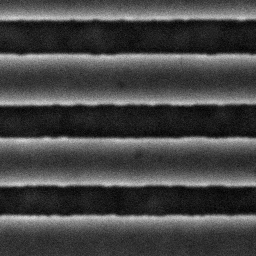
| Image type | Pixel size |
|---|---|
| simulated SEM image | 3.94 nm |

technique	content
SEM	lines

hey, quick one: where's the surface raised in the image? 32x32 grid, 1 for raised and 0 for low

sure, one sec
11111111111111111111111111111111
11111111111111111111111111111111
00000000000000000000000000000000
00000000000000000000000000000000
00000000000000000000000000000000
00000000000000000000000000000000
00000000000000000000000000000000
11111111111111111111111111111111
11111111111111111111111111111111
11111111111111111111111111111111
11111111111111111111111111111111
11111111111111111111111111111111
11111111111111111111111111111111
00000000000000000000000000000000
00000000000000000000000000000000
00000000000000000000000000000000
00000000000000000000000000000000
11111111111111111111111111111111
11111111111111111111111111111111
11111111111111111111111111111111
11111111111111111111111111111111
11111111111111111111111111111111
11111111111111111111111111111111
00000000000000000000000000000000
00000000000000000000000000000000
00000000000000000000000000000000
00000000000000000000000000000000
11111111111111111111111111111111
11111111111111111111111111111111
11111111111111111111111111111111
11111111111111111111111111111111
11111111111111111111111111111111